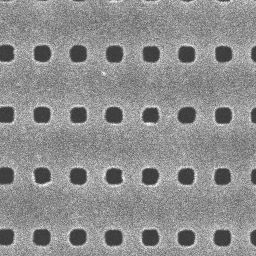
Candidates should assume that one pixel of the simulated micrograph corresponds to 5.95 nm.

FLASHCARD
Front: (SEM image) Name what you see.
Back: a regular array of holes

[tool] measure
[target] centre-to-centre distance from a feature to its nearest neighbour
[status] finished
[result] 214 nm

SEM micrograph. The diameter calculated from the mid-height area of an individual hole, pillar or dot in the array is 108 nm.